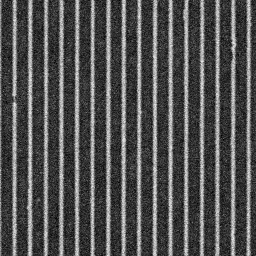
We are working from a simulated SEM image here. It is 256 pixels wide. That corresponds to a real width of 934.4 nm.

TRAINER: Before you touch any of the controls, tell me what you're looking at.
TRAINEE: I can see parallel lines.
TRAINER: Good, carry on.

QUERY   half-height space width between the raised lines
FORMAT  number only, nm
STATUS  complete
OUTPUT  45.1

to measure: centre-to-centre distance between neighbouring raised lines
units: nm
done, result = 56.9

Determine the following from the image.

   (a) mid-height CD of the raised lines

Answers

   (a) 10.5 nm